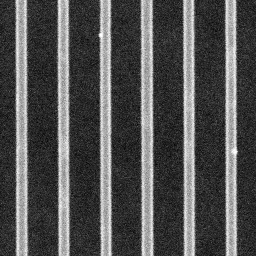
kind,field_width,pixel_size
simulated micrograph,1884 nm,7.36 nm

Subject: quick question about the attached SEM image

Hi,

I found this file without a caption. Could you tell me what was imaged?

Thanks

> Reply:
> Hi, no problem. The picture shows parallel lines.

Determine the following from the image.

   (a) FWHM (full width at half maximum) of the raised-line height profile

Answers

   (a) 71.8 nm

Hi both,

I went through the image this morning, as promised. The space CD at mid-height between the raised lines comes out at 32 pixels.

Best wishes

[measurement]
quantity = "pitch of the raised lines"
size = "308 nanometers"